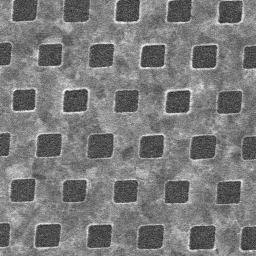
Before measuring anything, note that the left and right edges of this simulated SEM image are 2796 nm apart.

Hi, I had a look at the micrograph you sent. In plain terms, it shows a regular array of holes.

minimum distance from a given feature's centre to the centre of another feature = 0.56 micrometres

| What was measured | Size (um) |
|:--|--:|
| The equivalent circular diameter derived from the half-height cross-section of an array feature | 0.29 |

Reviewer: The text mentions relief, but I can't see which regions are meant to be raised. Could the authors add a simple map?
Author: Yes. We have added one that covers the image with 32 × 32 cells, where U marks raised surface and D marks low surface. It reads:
UUDDDUUUDDDUUUUDDDUUUDDDUUUDDDUU
UDDDDUUUDDDUUUDDDDUUUDDDUUUDDDUU
UUDDUUUUDDDUUUUDDUUUUDDDUUUDDDUU
UUUUUUUUUUUUUUUUUUUUUUUUUUUUUUUU
UUUUUUUUUUUUUUUUUUUUUUUUUUUUUUUU
DUUUUUDDUUUUDDUUUUUUUUUUUUUUUUUU
DUUUUDDDUUUDDDUUUUDDDUUUDDDUUUDD
DUUUUDDDUUUDDDUUUUDDDUUUDDDUUUDD
UUUUUUUUUUUDUUUUUUUUUUUUDDUUUUUD
UUUUUUUUUUUUUUUUUUUUUUUUUUUUUUUU
UUUUUUUUUUUUUUUUUUUUUUUUUUUUUUUU
UUDDUUUUDDDUUUUDDUUUUDDDUUUUDDUU
UUDDUUUUDDDUUUDDDUUUUDDDUUUDDDUU
UUDDUUUUDDDUUUDDDUUUUDDDUUUDDDUU
UUUUUUUUUUUUUUUUUUUUUUUUUUUUUUUU
UUUUUUUUUUUUUUUUUUUUUUUUUUUUUUUU
UUUUUUUUUUUUUUUUUUUUUUUUUUUUUUUU
DUUUUDDDUUUDDDUUUUDDDUUUDDDUUUDD
DUUUUDDDUUUDDDUUUDDDDUUUDDDUUUDD
DUUUUDDUUUUDDDUUUUDDUUUUDDDUUUDD
UUUUUUUUUUUUUUUUUUUUUUUUUUUUUUUU
UUUUUUUUUUUUUUUUUUUUUUUUUUUUUUUU
UUDDUUUUDDDUUUUDDUUUUUDUUUUUUUUU
UDDDUUUUDDDUUUDDDUUUDDDDUUUDDDUU
UDDDUUUUDDDUUUDDDUUUDDDDUUUDDDUU
UUUUUUUUUUUUUUUUUUUUUUUUUUUDDUUU
UUUUUUUUUUUUUUUUUUUUUUUUUUUUUUUU
UUUUUUUUUUUUUUUUUUUUUUUUUUUUUUUU
DUUUUDDDUUUDDDUUUDDDUUUUDDDUUUDD
DUUUDDDDUUUDDDUUUDDDUUUUDDDUUUDD
DUUUDDDUUUUDDDUUUDDDUUUUDDDUUUDD
UUUUUUUUUUUUUUUUUUUUUUUUUUUDUUUU